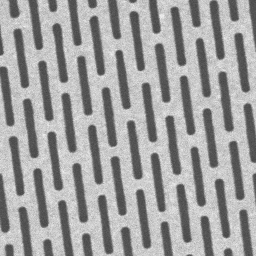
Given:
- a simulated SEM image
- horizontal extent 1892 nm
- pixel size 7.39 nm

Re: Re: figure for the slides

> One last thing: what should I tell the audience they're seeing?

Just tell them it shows a regular array of holes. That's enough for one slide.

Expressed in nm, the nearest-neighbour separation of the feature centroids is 286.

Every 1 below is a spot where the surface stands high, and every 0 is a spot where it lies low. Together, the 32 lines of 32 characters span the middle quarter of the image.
01100011001110011100111000111011
01110011001110001100111000111111
01110011001110001111111100111111
01110011111111001111111100111001
01110011111111001111111100111001
11110011111111001110001100111001
11110001100011001110001100011000
01110001100011001110001100011000
00110001100011000111001100011000
00110001110011000111001110111100
00111001110011100111001111111100
00111001110011111111001111111100
00111001110001111111000111111100
00111111110001111111000110011100
00111111110001110011000110001100
00111100110001110011100110001110
00011100111001110011100111001110
00011100111001110011100111001110
10011100111001110011100111001111
10011100011001110001110111001111
10011100011001110001111111000111
10011110011111111001111111000111
11111110011111111001110011000111
11111110011100111001110011100111
11111110011100111001110011100111
11001110011100111001110011100111
11001110001100111000110011100111
11000110001100111000110011100111
11000110001100111001110001111111
11000111001100011111110001111111
11100111111100011111111001110011
11100111111110011100111001110011